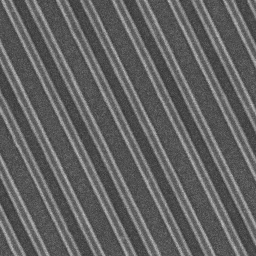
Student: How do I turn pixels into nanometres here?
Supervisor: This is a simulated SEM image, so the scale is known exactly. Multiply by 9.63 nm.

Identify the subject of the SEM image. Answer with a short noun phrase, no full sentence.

parallel lines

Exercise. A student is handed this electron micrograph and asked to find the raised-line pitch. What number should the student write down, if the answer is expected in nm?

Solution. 239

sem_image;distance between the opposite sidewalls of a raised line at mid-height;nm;85.4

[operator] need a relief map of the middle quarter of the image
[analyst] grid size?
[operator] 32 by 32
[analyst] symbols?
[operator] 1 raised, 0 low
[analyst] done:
10000011100011000000110000111000
10000001100001100000011000011000
11000001110001100000011000011000
11000000110000110000001100001100
01100000111000110000001100001100
01100000011000011000000110000110
00110000011100011000000110000110
00110000001100001100000011000011
00111000001110001100000011000011
00011000000110000110000001100001
00011100000111000110000001100001
00001100000011000011000001110000
10001110000011100011000000110000
10000110000001100011100000111000
11000111000001110001100000011000
11000011000000110001110000011100
11100011000000111000110000001100
01100001100000011000011000001110
01110001100000011000011000000110
00110000110000001100001100000111
00111000110000001100001100000011
00011000011000000110000110000011
00011100011000000110000110000001
00001100001100000011000111000001
00001110001100000011000011000000
00000110000110000001100001100000
00000111000110000001100001100000
00000011000011000000110001110000
10000011100011000000110000110000
10000001100001100000111000111000
11000001110001100000011000011000
11000000110000110000011100011100